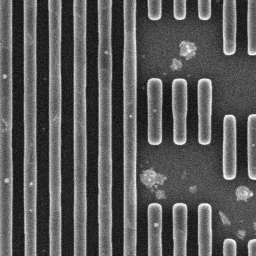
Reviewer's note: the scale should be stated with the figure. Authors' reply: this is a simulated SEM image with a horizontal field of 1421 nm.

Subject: wiring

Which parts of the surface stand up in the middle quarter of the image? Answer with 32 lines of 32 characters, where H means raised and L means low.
LLLHHLLLLHHHLLLHHHLLLLLLLLLLLLLL
LLLHHLLLLHHHLLLHHHLLLLLLLLLLLLLL
LLLHHLLLLHHHLLLHHHLLLLLLLLLLLLLL
LLLHHLLLLHHHLLLHHHLLLLLLLLLLLLLL
LLLHHLLLLHHHLLLHHHLLLHHHLLLHHHLL
LLLHHLLLLHHHLLLHHHLLLHHHLLLHHHHL
LLLHHLLLLHHHLLLHHHLLLHHHLLLHHHHL
LLLHHLLLLHHHLLLHHHLLLHHHLLLHHHHL
LLLHHLLLLHHHLLLHHHLLLHHHLLLHHHHL
LLLHHLLLLHHHLLLHHHLLLHHHLLLHHHHL
LLLHHLLLLHHHLLLHHHLLLHHHLLLHHHHL
LLLHHLLLLHHHLLLHHHLLLHHHLLLHHHHL
LLLHHLLLLHHHLLLHHHLLLHHHLLLHHHHL
LLLHHLLLLHHHLLLHHHLLLHHHLLLHHHLL
LLLHHLLLLHHHLLLHHHLLLHHHLLLLHHLL
LLLHHLLLLHHHLLLHHHLLLHHHLLLLHHLL
LLLHHLLLLHHHLLLHHHLLLHHHLLLLHHLL
LLLHHLLLLHHHLLLHHHLLLHHHLLLLHHLL
LLLHHLLLLHHHLLLHHHLLLHHHLLLLHHLL
LLLHHLLLLHHHLLLHHHLLLHHHLLLLHHLL
LLLHHLLLLHHHLLLHHHLLLLLLLLLLLLLL
LLLHHLLLLHHHLLLHHHLLLLLLLLLLLLLL
LLLHHLLLLHHHLLLHHHLLLLLLLLLLLLLL
LLLHHLLLLHHHLLLHHHLLLLLLLLLLLLLL
LLLHHLLLLHHHLLLHHHLLLLLLLLLLLLLL
LLLHHLLLLHHHLLLHHHLLLLLLLLLLLLLL
LLLHHLLLLHHHLLLHHHLLLLLLLLLLLLLL
LLLHHLLLLHHHLLLHHHLLLLLLLLLLLLLL
LLLHHLLLLHHHLLLHHHLLLLLLLLLLLLLL
LLLHHLLLLHHHLLLHHHLLLLLLLLLLLLLL
LLLHHLLLLHHHLLLHHHLLLLLLLLLLLLLL
LLLHHLLLLHHHLLLHHHLLLLLLLLLLLLLL